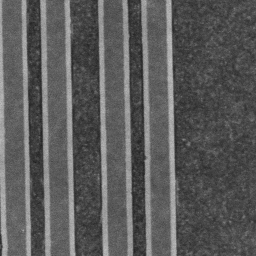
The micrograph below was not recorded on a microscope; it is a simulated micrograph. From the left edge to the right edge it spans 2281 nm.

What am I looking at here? parallel lines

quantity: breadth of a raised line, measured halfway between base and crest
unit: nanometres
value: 223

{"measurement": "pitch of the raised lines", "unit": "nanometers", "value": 438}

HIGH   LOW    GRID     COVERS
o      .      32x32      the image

ooo..ooo....oooo..ooo...........
ooo..ooo.....ooo..ooo...........
ooo..oooo....ooo..ooo...........
ooo..ooo.....ooo..ooo...........
ooo..oooo....ooo..ooo...........
ooo..oooo....ooo..ooo...........
ooo..oooo....ooo..ooo...........
ooo..oooo....ooo..ooo...........
ooo..oooo....ooo..ooo...........
ooo..oooo....ooo..ooo...........
ooo...ooo....ooo..ooo...........
ooo...ooo....ooo..ooo...........
ooo...ooo....ooo..ooo...........
ooo...ooo....ooo..ooo...........
ooo...ooo....ooo..ooo...........
ooo...ooo....ooo..ooo...........
ooo...ooo....ooo..ooo...........
ooo...ooo....ooo..ooo...........
ooo...ooo....ooo..oooo..........
ooo...ooo....ooo..oooo..........
ooo...ooo....ooo..oooo..........
ooo...ooo....ooo..oooo..........
ooo...ooo....ooo..oooo..........
ooo...ooo....ooo..oooo..........
oooo..ooo....ooo..oooo..........
oooo..ooo....ooo...ooo..........
oooo..ooo....ooo...ooo..........
oooo..ooo....ooo...ooo..........
oooo..ooo....ooo...ooo..........
oooo..ooo....ooo...ooo..........
.ooo..ooo....ooo...ooo..........
.ooo..ooo....ooo...ooo..........